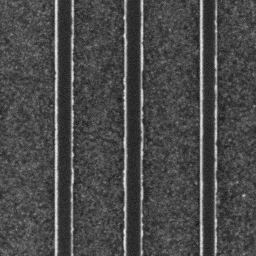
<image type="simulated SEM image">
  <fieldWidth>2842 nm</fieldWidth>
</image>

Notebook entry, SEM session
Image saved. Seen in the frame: lines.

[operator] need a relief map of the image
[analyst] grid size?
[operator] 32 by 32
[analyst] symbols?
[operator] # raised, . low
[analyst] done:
.......##.......##.......##.....
.......##.......##.......##.....
.......##.......##.......##.....
.......##.......##.......##.....
.......##.......##.......##.....
.......##.......##.......##.....
.......##.......##.......##.....
.......##.......##.......##.....
.......##.......##.......##.....
.......##.......##.......##.....
.......##.......##.......##.....
.......##.......##.......##.....
.......##.......##.......##.....
.......##.......##.......##.....
.......##.......##.......##.....
.......##.......##.......##.....
.......##.......##.......##.....
.......##.......##.......##.....
.......##.......##.......##.....
.......##.......##.......##.....
.......##.......##.......##.....
.......##.......##.......##.....
.......##.......##.......##.....
.......##.......##.......##.....
.......##.......##.......##.....
.......##.......##.......##.....
.......##.......##.......##.....
.......##.......##.......##.....
.......##.......##.......##.....
.......##.......##.......##.....
.......##.......##.......##.....
.......##.......##.......##.....